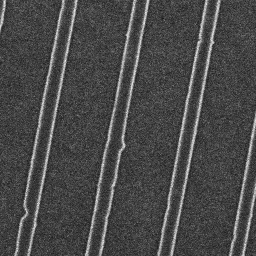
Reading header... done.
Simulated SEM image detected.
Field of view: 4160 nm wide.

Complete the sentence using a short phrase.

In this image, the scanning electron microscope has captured one or a few lines or trenches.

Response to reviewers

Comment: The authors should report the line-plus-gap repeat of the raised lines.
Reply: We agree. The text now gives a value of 1140 nanometers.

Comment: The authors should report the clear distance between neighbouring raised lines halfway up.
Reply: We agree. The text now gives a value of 0.916 um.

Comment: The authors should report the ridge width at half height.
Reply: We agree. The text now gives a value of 226 nm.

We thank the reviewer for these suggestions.